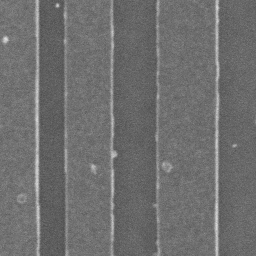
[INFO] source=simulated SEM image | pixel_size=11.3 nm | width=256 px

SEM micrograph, lines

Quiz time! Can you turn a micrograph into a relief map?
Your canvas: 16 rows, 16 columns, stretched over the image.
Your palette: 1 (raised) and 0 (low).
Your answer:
1100111000111100
1100111000111100
1100111000111100
1100111000111100
1100111000111100
1100111000111100
1100111000111100
1100111000111100
1100111000111100
1100111000111100
1100111000111100
1100111000111100
1100111000111100
1100111000111100
1100111000111100
1100111000111100